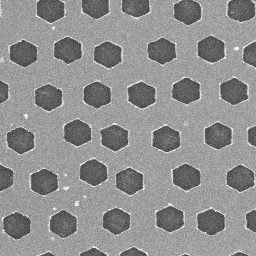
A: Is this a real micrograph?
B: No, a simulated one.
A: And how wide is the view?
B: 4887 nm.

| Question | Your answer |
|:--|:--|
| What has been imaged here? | a regular array of holes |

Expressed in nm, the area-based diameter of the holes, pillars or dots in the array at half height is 518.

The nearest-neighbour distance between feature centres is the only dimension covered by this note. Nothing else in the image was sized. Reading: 849 nm